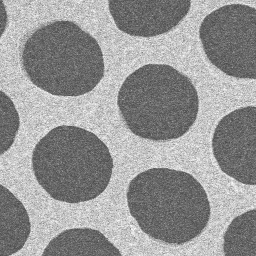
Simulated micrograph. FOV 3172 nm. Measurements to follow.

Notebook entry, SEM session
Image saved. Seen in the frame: holes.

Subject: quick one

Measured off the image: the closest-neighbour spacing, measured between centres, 1290 nanometers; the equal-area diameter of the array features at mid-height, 996 nm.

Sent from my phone